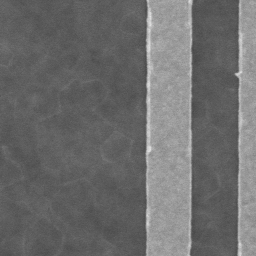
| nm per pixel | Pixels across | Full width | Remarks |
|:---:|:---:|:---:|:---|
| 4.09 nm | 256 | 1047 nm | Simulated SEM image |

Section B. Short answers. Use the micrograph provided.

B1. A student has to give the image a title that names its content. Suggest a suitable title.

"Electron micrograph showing one or a few lines or trenches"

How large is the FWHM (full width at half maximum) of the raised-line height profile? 179 nanometers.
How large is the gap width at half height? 197 nm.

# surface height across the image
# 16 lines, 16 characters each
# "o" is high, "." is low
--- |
.........ooo...o
.........ooo...o
.........ooo...o
.........ooo...o
.........ooo...o
.........ooo...o
.........ooo...o
.........ooo....
.........ooo...o
.........ooo...o
.........ooo...o
.........ooo...o
.........ooo...o
.........ooo...o
.........ooo...o
.........ooo...o